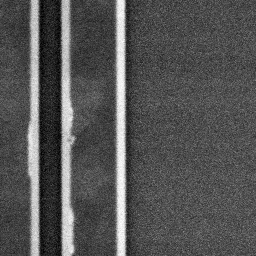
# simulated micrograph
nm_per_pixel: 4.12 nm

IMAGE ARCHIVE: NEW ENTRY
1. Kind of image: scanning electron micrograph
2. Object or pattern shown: one or a few lines or trenches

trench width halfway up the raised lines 126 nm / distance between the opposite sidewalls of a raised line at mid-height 230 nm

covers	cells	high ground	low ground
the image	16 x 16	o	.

oo..oooo........
oo..oooo........
oo..oooo........
oo..oooo........
oo..oooo........
oo..oooo........
oo..oooo........
oo..oooo........
oo..oooo........
oo..oooo........
oo..oooo........
oo..oooo........
oo..oooo........
oo..oooo........
oo..oooo........
oo..oooo........